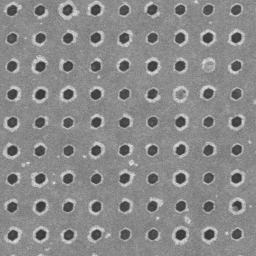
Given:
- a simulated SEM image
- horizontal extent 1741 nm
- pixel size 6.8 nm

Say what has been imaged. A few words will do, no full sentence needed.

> a regular array of holes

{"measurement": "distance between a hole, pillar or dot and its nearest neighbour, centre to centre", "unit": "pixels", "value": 27.8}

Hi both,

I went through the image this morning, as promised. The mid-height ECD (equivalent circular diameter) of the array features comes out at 75.2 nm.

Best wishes